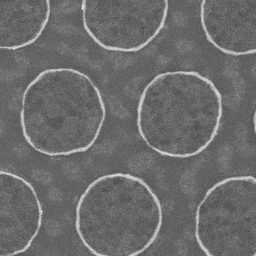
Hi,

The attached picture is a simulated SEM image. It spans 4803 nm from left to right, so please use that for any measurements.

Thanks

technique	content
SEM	raised bodies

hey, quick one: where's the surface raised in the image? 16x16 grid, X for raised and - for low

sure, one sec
XXX--XXXXX---XXX
XXX--XXXXX---XXX
XX----XXX----XXX
----------------
---XX-----------
--XXXX---XXXX---
-XXXXX---XXXXX--
-XXXXX---XXXXX--
--XXXX---XXXX---
---XX-----XX----
----------------
XX----XXX-----XX
XX---XXXXX---XXX
XX---XXXXX--XXXX
XX---XXXXX--XXXX
XX----XXX----XXX